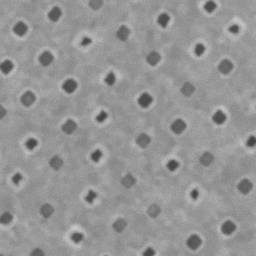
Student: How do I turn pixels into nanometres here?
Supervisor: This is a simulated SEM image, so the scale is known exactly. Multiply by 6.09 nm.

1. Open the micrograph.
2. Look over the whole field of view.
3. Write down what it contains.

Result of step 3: a regular array of holes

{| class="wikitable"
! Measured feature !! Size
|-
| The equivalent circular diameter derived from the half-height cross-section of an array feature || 89.5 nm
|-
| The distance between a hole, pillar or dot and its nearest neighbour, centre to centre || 230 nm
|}